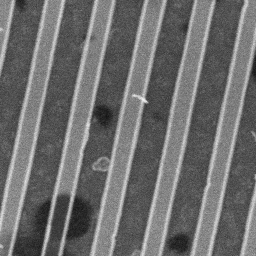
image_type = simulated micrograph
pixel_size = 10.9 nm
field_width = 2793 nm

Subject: parallel lines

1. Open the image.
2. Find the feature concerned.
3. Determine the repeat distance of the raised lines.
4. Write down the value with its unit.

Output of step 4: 0.532 um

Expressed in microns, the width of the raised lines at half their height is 0.208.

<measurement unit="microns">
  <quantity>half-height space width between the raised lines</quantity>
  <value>0.326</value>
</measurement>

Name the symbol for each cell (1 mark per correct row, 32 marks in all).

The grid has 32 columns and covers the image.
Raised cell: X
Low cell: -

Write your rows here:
XX----XX----XX----XXX---XXX----X
X----XXX----XX----XX----XXX---XX
X----XXX---XXX----XX----XX----XX
X----XX----XXX---XXX----XX----XX
X----XX----XX----XXX---XXX----XX
X----XX----XX----XX----XXX---XXX
X---XXX----XX----XX----XX----XXX
----XX----XXX----XX----XX----XXX
----XX----XXX---XXX---XXX----XX-
----XX----XX----XXX---XXX----XX-
----XX----XX----XX----XXX---XXX-
---XXX---XXX----XX----XX----XXX-
---XX----XXX----XX----XX----XX--
---XX----XXX---XXX---XXX----XX--
---XX----XX----XXX---XXX----XX--
--XXX----XX----XX----XXX---XXX--
--XXX---XXX----XX----XX----XX---
--XX----XXX---XXX----XX----XX---
--XX----XX----XXX----XX----XX---
--XX----XX----XXX---XXX----XX---
-XXX----XX----XX----XXX---XXX---
-XXX---XXX----XX----XX----XX----
-XX----XXX---XXX----XX----XX----
-XX----XX----XXX----XX----XX----
-XX----XX----XXX---XXX----XX----
XXX----XX----XX----XX----XXX---X
XXX---XXX----XX----XX----XXX---X
XX----XXX---XXX----XX----XX----X
XX----XX----XXX---XXX----XX----X
XX----XX----XX----XXX---XXX----X
XX----XX----XX----XX----XXX---XX
X----XXX----XX----XX----XX----XX